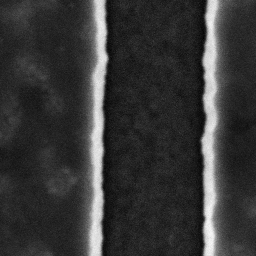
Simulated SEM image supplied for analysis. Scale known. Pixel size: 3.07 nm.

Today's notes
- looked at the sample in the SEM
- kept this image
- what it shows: one or a few lines or trenches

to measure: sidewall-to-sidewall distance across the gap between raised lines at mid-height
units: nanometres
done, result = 333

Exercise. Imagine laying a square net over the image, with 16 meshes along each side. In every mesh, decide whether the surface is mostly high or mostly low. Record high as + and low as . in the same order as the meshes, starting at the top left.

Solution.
++++++.......+++
++++++.......+++
++++++.......+++
++++++.......+++
++++++.......+++
++++++.......+++
++++++.......+++
++++++.......+++
++++++.......+++
++++++.......+++
++++++.......+++
++++++.......+++
++++++.......+++
++++++.......+++
++++++.......+++
++++++.......+++